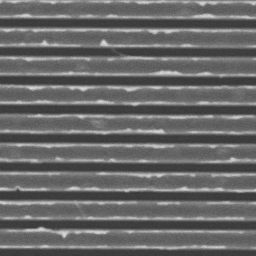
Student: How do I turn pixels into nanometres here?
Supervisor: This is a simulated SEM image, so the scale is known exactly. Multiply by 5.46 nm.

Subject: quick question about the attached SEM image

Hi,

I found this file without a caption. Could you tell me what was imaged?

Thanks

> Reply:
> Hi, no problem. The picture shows parallel lines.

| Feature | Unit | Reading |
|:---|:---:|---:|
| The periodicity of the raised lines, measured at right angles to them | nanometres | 157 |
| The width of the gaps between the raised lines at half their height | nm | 51.8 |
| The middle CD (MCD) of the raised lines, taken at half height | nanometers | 104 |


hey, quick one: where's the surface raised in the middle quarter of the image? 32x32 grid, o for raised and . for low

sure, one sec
oooooooooooooooooooooooooooooooo
oooooooooooooooooooooooooooooooo
oooooooooooooooooooooooooooooooo
................................
................................
................................
oooooooooooooooooooooooooooooooo
oooooooooooooooooooooooooooooooo
oooooooooooooooooooooooooooooooo
oooooooooooooooooooooooooooooooo
................................
................................
................................
oooooooooooooooooooooooooooooooo
oooooooooooooooooooooooooooooooo
oooooooooooooooooooooooooooooooo
oooooooooooooooooooooooooooooooo
.........oo.....................
................................
................................
oooooooooooooooooooooooooooooooo
oooooooooooooooooooooooooooooooo
oooooooooooooooooooooooooooooooo
oooooooooooooooooooooooooooooooo
..................oooooooooooooo
................................
................................
oooooooooooooooooooooooooooooooo
oooooooooooooooooooooooooooooooo
oooooooooooooooooooooooooooooooo
oooooooooooooooooooooooooooooooo
oooooooooooooooooooooooooooooooo